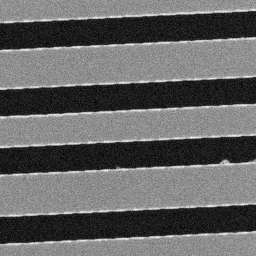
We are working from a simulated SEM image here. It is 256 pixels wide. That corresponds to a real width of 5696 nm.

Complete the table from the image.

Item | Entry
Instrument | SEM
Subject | lines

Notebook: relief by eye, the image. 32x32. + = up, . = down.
++++++++++++++++++++++++++++++++
++++++++++++++++++++++++++......
+++++++.........................
................................
................................
..................++++++++++++++
++++++++++++++++++++++++++++++++
++++++++++++++++++++++++++++++++
++++++++++++++++++++++++++++++++
++++++++++++++++++++++++++++++++
++++++++++++....................
................................
................................
.......................+++++++++
....++++++++++++++++++++++++++++
++++++++++++++++++++++++++++++++
++++++++++++++++++++++++++++++++
+++++++++++++++++++.............
................................
................................
............................++++
........++++++++++++++++++++++++
++++++++++++++++++++++++++++++++
++++++++++++++++++++++++++++++++
++++++++++++++++++++++++++++++++
+++++++++++++++++++++++++++++++.
++++++++++++....................
................................
................................
....................++++++++++++
.+++++++++++++++++++++++++++++++
++++++++++++++++++++++++++++++++